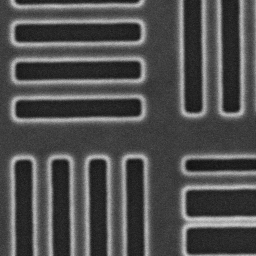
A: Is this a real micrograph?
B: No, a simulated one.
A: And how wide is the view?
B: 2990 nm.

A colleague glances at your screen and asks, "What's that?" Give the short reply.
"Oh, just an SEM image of groups of lines, slits or small figures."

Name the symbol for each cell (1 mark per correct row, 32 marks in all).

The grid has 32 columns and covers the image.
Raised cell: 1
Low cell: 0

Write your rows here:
11000000000000000111111001100011
11111111111111111111111001100011
11111111111111111111111001100011
11000000000000000011111001100011
11000000000000000011111001100011
11100111111111111111111001110011
11111111111111111111111001110011
11111110000000000111111001110011
11000000000000000011111001110011
11000000000000000011111001110011
11111111111111111111111001110011
11111111111111111111111001110011
11000000000000000011111001110011
11000000000000000011111001110011
11000000000000000011111111111111
11111111111111111111111111111111
11111111111111111111111111111111
11111111111111111111111111111111
11111111111111111111111111111111
11111111111111111111111111111111
11001100011000110011111000000000
11001100011000110011111100000000
11001100011000110011111111111111
11001100011000110011111111000000
11001100011000110011111000000000
11001100011000110011111000000000
11001100011000110011111000000000
11001100011000110011111111111111
11001100011000110011111000000000
11001100011000110011111000000000
11001100011000110011111000000000
11001100011000110011111000000000